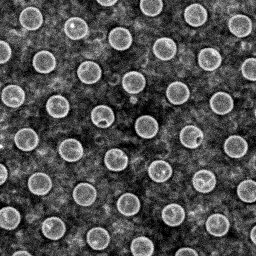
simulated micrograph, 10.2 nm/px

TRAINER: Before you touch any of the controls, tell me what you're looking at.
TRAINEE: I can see a regular array of raised bodies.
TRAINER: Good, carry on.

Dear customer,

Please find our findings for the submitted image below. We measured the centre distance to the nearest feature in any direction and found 464 nanometres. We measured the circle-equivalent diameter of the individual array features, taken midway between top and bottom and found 232 nanometers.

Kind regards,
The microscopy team